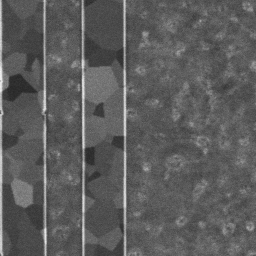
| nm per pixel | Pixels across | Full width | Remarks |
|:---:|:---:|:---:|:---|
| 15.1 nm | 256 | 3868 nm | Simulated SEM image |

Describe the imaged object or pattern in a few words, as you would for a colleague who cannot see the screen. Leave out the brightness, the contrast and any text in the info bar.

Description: one or a few lines or trenches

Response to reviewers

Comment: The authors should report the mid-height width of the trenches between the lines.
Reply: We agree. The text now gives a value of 574 nm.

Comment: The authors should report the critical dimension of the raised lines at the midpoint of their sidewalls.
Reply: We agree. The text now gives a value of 0.653 µm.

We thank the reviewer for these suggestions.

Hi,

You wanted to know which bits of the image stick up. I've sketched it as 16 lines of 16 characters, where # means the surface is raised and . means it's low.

###..###........
###..###........
###..###........
###..###........
###..###........
###..###........
###..###........
###..###........
###..###........
###..###........
###..###........
###..###........
###..###........
###..###........
###..###........
###..###........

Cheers